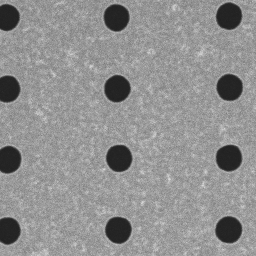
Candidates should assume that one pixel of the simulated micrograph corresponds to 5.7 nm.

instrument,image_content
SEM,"a regular array of holes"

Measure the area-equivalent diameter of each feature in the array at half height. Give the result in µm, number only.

0.15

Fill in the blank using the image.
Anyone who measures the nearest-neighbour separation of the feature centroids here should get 404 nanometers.